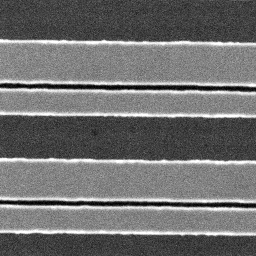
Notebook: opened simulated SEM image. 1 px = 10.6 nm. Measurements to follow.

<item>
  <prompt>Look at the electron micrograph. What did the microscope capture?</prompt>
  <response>lines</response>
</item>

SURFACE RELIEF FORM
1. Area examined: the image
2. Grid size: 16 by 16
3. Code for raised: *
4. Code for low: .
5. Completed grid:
................
................
................
****************
****************
****************
****************
................
................
................
****************
****************
****************
****************
.***************
................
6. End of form